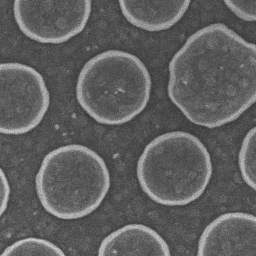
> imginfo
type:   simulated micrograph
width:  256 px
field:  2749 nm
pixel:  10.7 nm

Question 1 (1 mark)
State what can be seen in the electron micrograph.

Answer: raised bodies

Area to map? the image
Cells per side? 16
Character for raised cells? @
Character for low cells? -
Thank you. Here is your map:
-@@@@---@@@@---@
-@@@@----@@-----
---@--------@@@-
------@@---@@@@@
@@---@@@@--@@@@@
@@@--@@@@--@@@@@
@@@--@@@@--@@@@@
@@----@@----@@--
----------@@----
----@@---@@@@--@
---@@@@--@@@@--@
--@@@@@--@@@@---
---@@@----@@----
----@---------@-
-------@@----@@@
-@@---@@@@---@@@